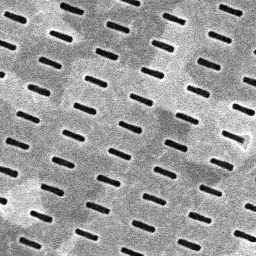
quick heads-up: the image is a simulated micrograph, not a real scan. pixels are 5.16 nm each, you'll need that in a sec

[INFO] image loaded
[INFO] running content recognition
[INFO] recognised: a regular array of holes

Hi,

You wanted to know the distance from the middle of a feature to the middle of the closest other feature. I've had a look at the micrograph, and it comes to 0.15 µm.